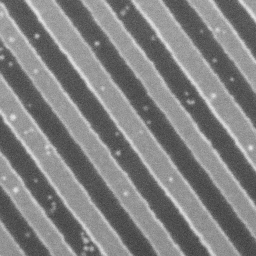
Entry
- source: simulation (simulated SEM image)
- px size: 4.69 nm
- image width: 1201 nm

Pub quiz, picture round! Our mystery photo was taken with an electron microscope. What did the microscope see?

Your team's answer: lines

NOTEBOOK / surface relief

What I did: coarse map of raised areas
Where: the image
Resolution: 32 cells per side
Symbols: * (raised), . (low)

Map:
....***....**....***....***...**
*...****...***....***....***...*
**...****...***...****...***....
**....***....***...****...***...
***...****....**....***....***..
.***...****...***....***....**..
.***....****...***...****...***.
..***....***....***...****...***
...***....***...***....***....**
....***...****...***...****....*
*...***....***....***...****...*
**...***....***...***....***....
**....***...****...***....***...
***...****...****...***...****..
****...***....***....***...****.
.***....***....***...***....***.
..***....***...****...***....***
..****...****...***....***...***
...****...***....***....***...**
....***....***...****...***....*
*....***....***...****...***...*
**...****...****...***....***...
***...****...***....***...***...
***....***....***...****...***..
.***...****...****...****...***.
..***...****...***....***....***
...***...****...***....***...***
...***....***....***...****...**
*...***....***...****...****...*
*....***...****...***....***....
**....**....***....***....***...
***...***....***....***...****..